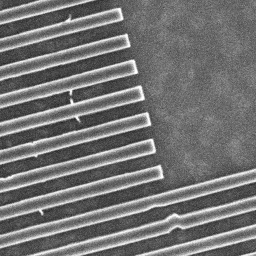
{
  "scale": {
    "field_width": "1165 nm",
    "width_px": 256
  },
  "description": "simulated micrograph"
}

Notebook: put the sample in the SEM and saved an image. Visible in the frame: parallel lines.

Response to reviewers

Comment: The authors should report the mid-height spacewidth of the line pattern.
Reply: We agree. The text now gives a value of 66.1 nm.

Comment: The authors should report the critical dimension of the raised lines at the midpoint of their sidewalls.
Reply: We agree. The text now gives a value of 0.0573 um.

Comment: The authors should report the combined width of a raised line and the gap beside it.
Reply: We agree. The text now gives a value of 0.123 um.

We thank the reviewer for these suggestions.